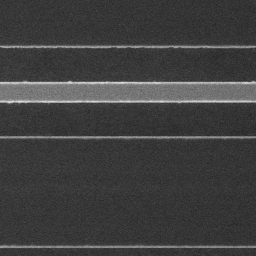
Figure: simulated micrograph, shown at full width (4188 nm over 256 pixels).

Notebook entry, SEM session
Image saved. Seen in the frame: lines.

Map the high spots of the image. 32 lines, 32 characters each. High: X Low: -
XXXXXXXXXXXXXXXXXXXXXXXXXXXXXXXX
XXXXXXXXXXXXXXXXXXXXXXXXXXXXXXXX
XXXXXXXXXXXXXXXXXXXXXXXXXXXXXXXX
XXXXXXXXXXXXXXXXXXXXXXXXXXXXXXXX
XXXXXXXXXXXXXXXXXXXXXXXXXXXXXXXX
XXXXXXXXXXXXXXXXXXXXXXXXXXXXXXXX
--------------------------------
--------------------------------
--------------------------------
--------------------------------
XXXXXXXXXXXXXXXXXXXXXXXXXXXXXXXX
XXXXXXXXXXXXXXXXXXXXXXXXXXXXXXXX
XXXXXXXXXXXXXXXXXXXXXXXXXXXXXXXX
--------------------------------
--------------------------------
--------------------------------
--------------------------------
XXXXXXXXXXXXXXXXXXXXXXXXXXXXXXXX
XXXXXXXXXXXXXXXXXXXXXXXXXXXXXXXX
XXXXXXXXXXXXXXXXXXXXXXXXXXXXXXXX
XXXXXXXXXXXXXXXXXXXXXXXXXXXXXXXX
XXXXXXXXXXXXXXXXXXXXXXXXXXXXXXXX
XXXXXXXXXXXXXXXXXXXXXXXXXXXXXXXX
XXXXXXXXXXXXXXXXXXXXXXXXXXXXXXXX
XXXXXXXXXXXXXXXXXXXXXXXXXXXXXXXX
XXXXXXXXXXXXXXXXXXXXXXXXXXXXXXXX
XXXXXXXXXXXXXXXXXXXXXXXXXXXXXXXX
XXXXXXXXXXXXXXXXXXXXXXXXXXXXXXXX
XXXXXXXXXXXXXXXXXXXXXXXXXXXXXXXX
XXXXXXXXXXXXXXXXXXXXXXXXXXXXXXXX
XXXXXXXXXXXXXXXXXXXXXXXXXXXXXXXX
--------------------------------